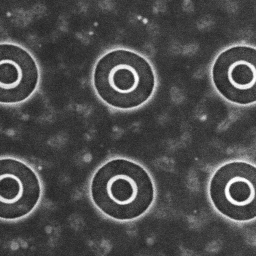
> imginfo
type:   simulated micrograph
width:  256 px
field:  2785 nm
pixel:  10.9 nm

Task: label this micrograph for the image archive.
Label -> ring-shaped grooves with a dot in the middle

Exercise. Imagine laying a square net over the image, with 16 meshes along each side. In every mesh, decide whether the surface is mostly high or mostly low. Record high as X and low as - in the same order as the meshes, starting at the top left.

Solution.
XXXXXXXXXXXXXXXX
XXXXXXXXXXXXXXXX
XXXXXXXXXXXXXXXX
--XXXXX--XXXXX--
--XXXX----XXX---
--XXXX----XXXX--
XXXXXXX--XXXXXXX
XXXXXXXXXXXXXXXX
XXXXXXXXXXXXXXXX
XXXXXXXXXXXXXXXX
--XXXX---XXXXX--
--XXXX---XXXX---
--XXXX---XXXX---
-XXXXXX--XXXXX--
XXXXXXXXXXXXXXXX
XXXXXXXXXXXXXXXX